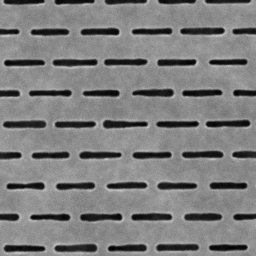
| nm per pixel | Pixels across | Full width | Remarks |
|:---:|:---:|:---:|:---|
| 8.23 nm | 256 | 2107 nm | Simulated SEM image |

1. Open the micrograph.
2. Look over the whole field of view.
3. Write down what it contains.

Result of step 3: a regular array of holes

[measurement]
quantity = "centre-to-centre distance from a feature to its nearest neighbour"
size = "321 nanometres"